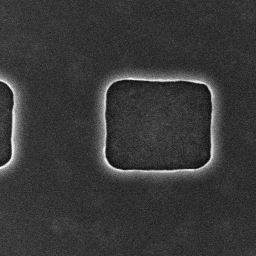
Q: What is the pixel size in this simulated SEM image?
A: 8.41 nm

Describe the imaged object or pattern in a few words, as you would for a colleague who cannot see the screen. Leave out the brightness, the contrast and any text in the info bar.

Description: holes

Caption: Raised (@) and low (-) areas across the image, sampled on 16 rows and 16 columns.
@@@@@@@@@@@@@@@@
@@@@@@@@@@@@@@@@
@@@@@@@@@@@@@@@@
@@@@@@@@@@@@@@@@
@@@@@@@@@@@@@@@@
-@@@@@@------@@@
-@@@@@@------@@@
-@@@@@@------@@@
-@@@@@@------@@@
-@@@@@@------@@@
@@@@@@@-----@@@@
@@@@@@@@@@@@@@@@
@@@@@@@@@@@@@@@@
@@@@@@@@@@@@@@@@
@@@@@@@@@@@@@@@@
@@@@@@@@@@@@@@@@